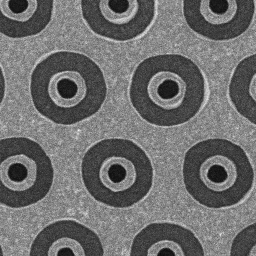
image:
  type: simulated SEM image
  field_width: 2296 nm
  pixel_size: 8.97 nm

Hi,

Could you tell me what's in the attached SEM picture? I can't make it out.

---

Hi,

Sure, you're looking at ring-shaped grooves with a dot in the middle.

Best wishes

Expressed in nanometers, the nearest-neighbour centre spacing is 868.